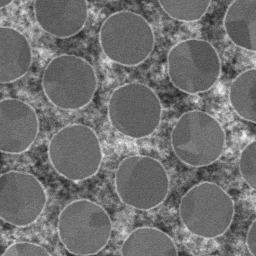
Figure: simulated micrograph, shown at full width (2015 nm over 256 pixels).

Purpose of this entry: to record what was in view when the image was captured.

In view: a regular array of raised bodies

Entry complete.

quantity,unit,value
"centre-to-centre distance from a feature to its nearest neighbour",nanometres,558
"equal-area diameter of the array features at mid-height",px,54.4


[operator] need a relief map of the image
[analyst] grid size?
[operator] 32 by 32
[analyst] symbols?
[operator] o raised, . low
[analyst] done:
o...ooooooo.........oooooo...ooo
....ooooooo....o.....ooooo..oooo
.....oooooo..ooooo....ooo...oooo
o....ooooo...oooooo.........oooo
ooo....oo....oooooo..........ooo
oooo.........oooooo...oooo...ooo
oooo.........oooooo..oooooo.....
oooo...ooo....oooo...oooooo.....
oooo..oooooo.........ooooooo....
ooo..ooooooo.........oooooo...oo
.....ooooooo....oo....ooooo..ooo
......oooooo..ooooo....oo....ooo
.o....ooooo...oooooo.........ooo
oooo....oo....oooooo.........ooo
ooooo.........oooooo...ooo....oo
ooooo.........oooooo..ooooo.....
ooooo..ooooo...oooo...oooooo....
oooo..oooooo.........ooooooo....
ooo...ooooooo.........oooooo...o
......ooooooo....o....ooooo...oo
.......ooooo...ooooo...ooo....oo
.o.....ooooo...oooooo.........oo
ooooo.........ooooooo..........o
ooooo..........oooooo...oooo....
oooooo.........oooooo..oooooo...
oooooo...ooo....oooo...oooooo...
ooooo...ooooo.........ooooooo...
oooo...ooooooo.........oooooo...
.......ooooooo....o....ooooo...o
.......ooooooo..ooooo....oo....o
..oo....ooooo..ooooooo.........o
.ooooo...ooo...ooooooo.........o